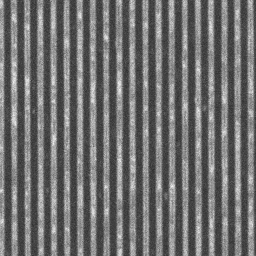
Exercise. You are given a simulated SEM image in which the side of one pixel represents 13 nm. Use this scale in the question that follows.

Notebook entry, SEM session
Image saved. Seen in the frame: parallel lines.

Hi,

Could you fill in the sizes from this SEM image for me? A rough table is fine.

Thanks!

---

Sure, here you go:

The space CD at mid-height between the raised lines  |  116 nm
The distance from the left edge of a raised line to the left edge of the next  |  0.171 um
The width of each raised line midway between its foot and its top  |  52.2 nm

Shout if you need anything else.